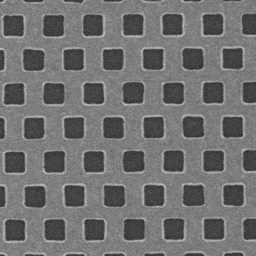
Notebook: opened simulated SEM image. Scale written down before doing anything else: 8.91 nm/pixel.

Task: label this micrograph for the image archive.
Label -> a regular array of holes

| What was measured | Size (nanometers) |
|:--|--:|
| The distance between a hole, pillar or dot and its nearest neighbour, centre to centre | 348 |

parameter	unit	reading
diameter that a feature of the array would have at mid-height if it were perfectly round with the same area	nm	216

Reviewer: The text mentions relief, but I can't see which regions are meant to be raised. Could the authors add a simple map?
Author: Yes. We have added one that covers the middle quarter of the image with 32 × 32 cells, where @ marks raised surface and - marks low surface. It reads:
-----@@@@@-----@@@@@-----@@@@@--
-----@@@@@@@--@@@@@@@@--@@@@@@@-
@@@@@@@@@@@@@@@@@@@@@@@@@@@@@@@@
@@@@@@@@@@@@@@@@@@@@@@@@@@@@@@@@
@@@@@@@@@@@@@@@----@@@@@@@@--@@@
@@@@@-----@@@@------@@@@@-----@@
@@@@@-----@@@@------@@@@@-----@@
@@@@@-----@@@@@-----@@@@@-----@@
@@@@@-----@@@@@-----@@@@@-----@@
@@@@@-----@@@@@-----@@@@@-----@@
@@@@@@@@@@@@@@@@@@@@@@@@@@@@@@@@
@@@@@@@@@@@@@@@@@@@@@@@@@@@@@@@@
@@@@@@@@@@@@@@@@@@@@@@@@@@@@@@@@
-----@@@@@-----@@@@@-----@@@@@--
-----@@@@@-----@@@@------@@@@---
-----@@@@@-----@@@@------@@@@@--
-----@@@@@-----@@@@------@@@@@--
-----@@@@@-----@@@@------@@@@@--
-----@@@@@-----@@@@@----@@@@@@@-
@@@@@@@@@@@@@@@@@@@@@@@@@@@@@@@@
@@@@@@@@@@@@@@@@@@@@@@@@@@@@@@@@
@@@@@@@@@@@@@@@@@@@@@@@@@@---@@@
@@@@@-----@@@@@-----@@@@@-----@@
@@@@@-----@@@@@-----@@@@@-----@@
@@@@@-----@@@@@-----@@@@@-----@@
@@@@@-----@@@@@-----@@@@@-----@@
@@@@@-----@@@@@-----@@@@@-----@@
@@@@@@@@@@@@@@@@@@@@@@@@@@@@@@@@
@@@@@@@@@@@@@@@@@@@@@@@@@@@@@@@@
@@@@@@@@@@@@@@@@@@@@@@@@@@@@@@@@
-----@@@@@-----@@@@@-----@@@@@--
-----@@@@@-----@@@@@-----@@@@@--